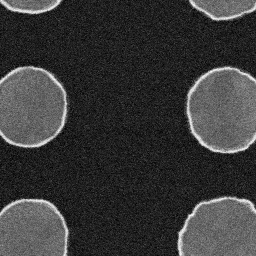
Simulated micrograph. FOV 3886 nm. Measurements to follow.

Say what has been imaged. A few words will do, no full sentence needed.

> raised bodies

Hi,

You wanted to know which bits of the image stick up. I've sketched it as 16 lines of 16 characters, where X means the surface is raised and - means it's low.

-XX---------XXXX
----------------
----------------
----------------
-XX----------XX-
XXXX--------XXXX
XXXX--------XXXX
XXXX--------XXXX
XXX---------XXXX
----------------
----------------
----------------
-X------------X-
XXXX--------XXXX
XXXX-------XXXXX
XXXX-------XXXXX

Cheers